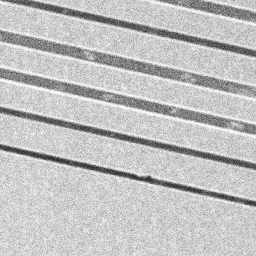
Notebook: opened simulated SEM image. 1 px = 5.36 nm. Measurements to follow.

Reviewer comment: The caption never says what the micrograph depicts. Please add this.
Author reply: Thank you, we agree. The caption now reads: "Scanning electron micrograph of parallel lines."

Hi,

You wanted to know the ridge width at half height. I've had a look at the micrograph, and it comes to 0.141 µm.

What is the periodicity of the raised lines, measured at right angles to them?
196 nm